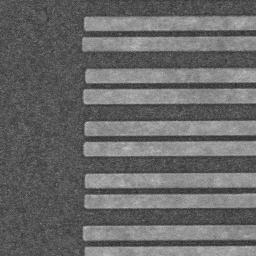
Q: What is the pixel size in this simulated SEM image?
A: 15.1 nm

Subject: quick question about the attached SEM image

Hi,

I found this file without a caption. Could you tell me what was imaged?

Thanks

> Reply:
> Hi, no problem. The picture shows parallel lines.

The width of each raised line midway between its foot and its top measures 13.5 px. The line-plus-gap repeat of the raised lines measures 395 nm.